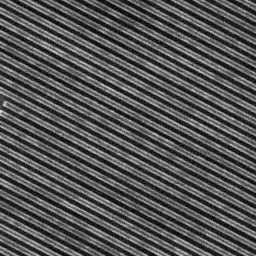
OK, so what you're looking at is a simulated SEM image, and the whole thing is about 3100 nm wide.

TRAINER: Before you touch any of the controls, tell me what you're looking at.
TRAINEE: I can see parallel lines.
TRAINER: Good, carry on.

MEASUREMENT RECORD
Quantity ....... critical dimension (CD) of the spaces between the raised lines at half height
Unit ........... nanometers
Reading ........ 64.3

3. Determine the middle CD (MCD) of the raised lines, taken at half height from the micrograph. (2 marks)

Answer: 0.055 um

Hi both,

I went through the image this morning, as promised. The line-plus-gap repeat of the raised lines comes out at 122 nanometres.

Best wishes